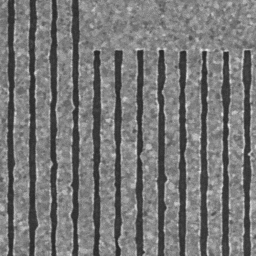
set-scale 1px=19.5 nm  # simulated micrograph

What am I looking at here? parallel lines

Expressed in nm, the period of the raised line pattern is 417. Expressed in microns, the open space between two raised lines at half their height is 0.139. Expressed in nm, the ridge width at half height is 277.